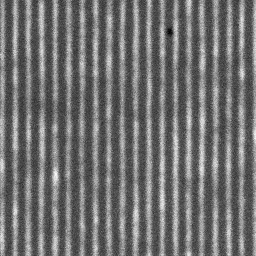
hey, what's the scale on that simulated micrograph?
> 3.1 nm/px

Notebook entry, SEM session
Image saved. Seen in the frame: parallel lines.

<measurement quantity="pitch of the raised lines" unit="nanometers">41.2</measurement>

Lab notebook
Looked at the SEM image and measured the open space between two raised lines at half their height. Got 0.0314 micrometres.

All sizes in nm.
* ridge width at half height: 10.5